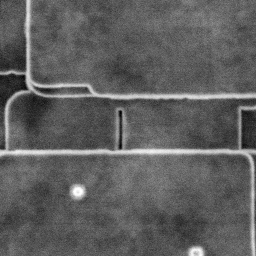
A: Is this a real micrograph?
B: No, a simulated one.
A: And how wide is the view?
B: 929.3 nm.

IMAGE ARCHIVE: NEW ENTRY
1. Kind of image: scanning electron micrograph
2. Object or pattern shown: wiring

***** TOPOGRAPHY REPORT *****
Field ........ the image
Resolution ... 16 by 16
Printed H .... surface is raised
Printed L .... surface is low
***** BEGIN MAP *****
LLHHHHHHHHHHHHHH
LLHHHHHHHHHHHHHH
LLHHHHHHHHHHHHHH
LLHHHHHHHHHHHHHH
LLHHHHHHHHHHHHHH
LLLLLHHHHHHHHHHH
LLLLLLLLLLLLLLLL
LLLLLLLLLLLLLLLL
LLLLLLLLLLLLLLLL
LHHHHHHHHHHHHHHL
HHHHHHHHHHHHHHHH
HHHHHHHHHHHHHHHH
HHHHHHHHHHHHHHHH
HHHHHHHHHHHHHHHH
HHHHHHHHHHHHHHHH
HHHHHHHHHHHHHHHH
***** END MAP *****